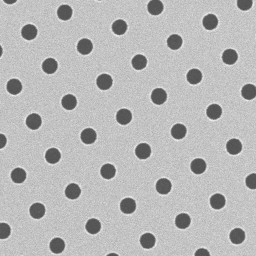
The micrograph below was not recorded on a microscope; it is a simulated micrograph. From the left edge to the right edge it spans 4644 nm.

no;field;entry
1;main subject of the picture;a regular array of holes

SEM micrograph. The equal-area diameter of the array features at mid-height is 0.299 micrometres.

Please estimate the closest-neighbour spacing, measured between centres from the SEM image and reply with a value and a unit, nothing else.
721 nm